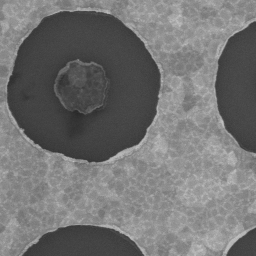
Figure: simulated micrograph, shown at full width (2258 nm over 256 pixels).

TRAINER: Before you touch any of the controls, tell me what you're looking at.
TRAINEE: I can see ring-shaped grooves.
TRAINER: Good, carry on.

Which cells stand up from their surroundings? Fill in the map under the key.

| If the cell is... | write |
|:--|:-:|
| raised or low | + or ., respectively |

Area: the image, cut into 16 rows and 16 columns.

++++++++++++++++
++......++++++++
++.......+++++..
+........+++++..
+...++....++++..
...++++...+++...
....++....++++..
+.........++++..
++.......+++++..
+++.....++++++++
++++++++++++++++
++++++++++++++++
++++++++++++++++
++++++++++++++++
+++.....+++++++.
++.......+++++..